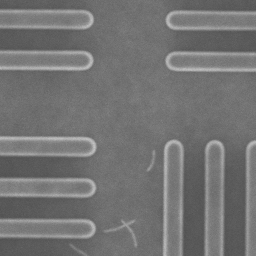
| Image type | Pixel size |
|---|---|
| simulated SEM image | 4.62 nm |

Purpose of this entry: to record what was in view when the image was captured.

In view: groups of lines, slits or small figures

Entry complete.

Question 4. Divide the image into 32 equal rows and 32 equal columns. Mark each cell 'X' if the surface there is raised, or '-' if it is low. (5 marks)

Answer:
--------------------------------
XXXXXXXXXXX-----------XXXXXXXXX-
XXXXXXXXXXXX---------XXXXXXXXXXX
----------------------XXXXXXXXXX
--------------------------------
--------------------------------
XXXXXXXXXXX---------------------
XXXXXXXXXXX----------XXXXXXXXXXX
--XXXXXXXXX----------XXXXXXXXXXX
--------------------------------
--------------------------------
--------------------------------
--------------------------------
--------------------------------
--------------------------------
--------------------------------
--------------------------------
XXXXXXXXXXX---------------------
XXXXXXXXXXXX---------XX---XX---X
---------------------XX---XX---X
---------------------XX---XX---X
---------------------XX---XX---X
XXXXXXXXXXX----------XX---XX---X
XXXXXXXXXXXX---------XX---XX---X
---XXXXXXXX----------XX---XX---X
---------------------XX---XX---X
---------------------XX---XX---X
XX-------------------XX---XX---X
XXXXXXXXXXXX---------XX---XX---X
XXXXXXXXXXX----------XX---XX---X
---------------------XX---XX---X
---------------------XX---XX---X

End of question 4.